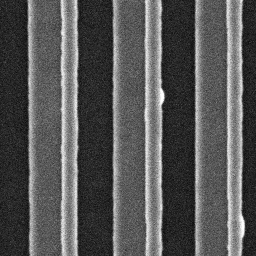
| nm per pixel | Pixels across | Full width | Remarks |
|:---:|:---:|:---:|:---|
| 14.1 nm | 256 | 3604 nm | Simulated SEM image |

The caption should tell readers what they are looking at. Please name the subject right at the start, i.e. lines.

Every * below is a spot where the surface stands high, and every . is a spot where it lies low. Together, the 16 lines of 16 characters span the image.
..***..***..***.
..***..***..***.
..***..***..***.
..***..***..***.
..***..***..***.
..***..***..***.
..***..***..***.
..***..***..***.
..***..***..***.
..***..***..***.
..***..***..***.
..***..***..***.
..***..***..***.
..***..***..***.
..***..***..***.
..***..***..***.